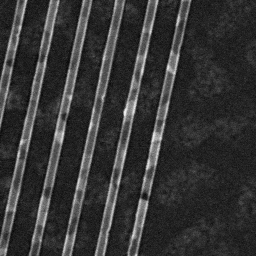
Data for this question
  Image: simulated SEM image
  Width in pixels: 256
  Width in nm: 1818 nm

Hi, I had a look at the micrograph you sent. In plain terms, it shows parallel lines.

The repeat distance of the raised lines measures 229 nanometres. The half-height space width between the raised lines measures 170 nm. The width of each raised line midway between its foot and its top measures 56.5 nanometres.